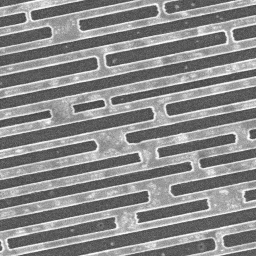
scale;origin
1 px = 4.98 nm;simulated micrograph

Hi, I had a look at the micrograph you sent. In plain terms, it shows parallel lines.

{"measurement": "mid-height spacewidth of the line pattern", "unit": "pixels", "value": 12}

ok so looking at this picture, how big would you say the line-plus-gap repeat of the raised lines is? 99.3 nanometres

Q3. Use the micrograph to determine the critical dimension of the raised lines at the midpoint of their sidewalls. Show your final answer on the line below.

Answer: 39.7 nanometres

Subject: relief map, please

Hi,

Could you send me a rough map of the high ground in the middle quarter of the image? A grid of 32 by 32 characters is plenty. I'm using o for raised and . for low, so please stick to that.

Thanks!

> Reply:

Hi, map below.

.........o....ooooooooo.........
........oooooooooo..............
...oooooooooo................ooo
oooooooo................oooooooo
oooo...............ooooooooooo..
..............ooooooooooo.......
.........ooooooooooo............
....ooooooooooo............ooooo
oooooooooooo..........oooooooooo
ooooo.....oo.....ooooooooooo....
oo........ooooooooooooooo.......
oo.....ooooooooooo....ooo.......
ooooooooooooo..........ooo....oo
oooooooo...............ooooooooo
ooo.................ooooooooo...
...............ooooooooo........
..........ooooooooo.............
.....oooooooooo..............ooo
ooooooooooooooo.........oooooooo
oooo....oooooooo....oooooooooo..
........ooooooooooooooooo.......
........ooooooooooooooo.........
.....oooooooooo....oooo.......oo
oooooooooo.........ooooo.ooooooo
oooooo.............ooooooooooo.o
o..............oooooooooo.......
..........oooooooooo............
.....oooooooooo.............oooo
oooooooooo.............ooooooooo
ooooo.............oooooooooooo..
.............oooooooooooooo.....
........ooooooooooooooooooo.....